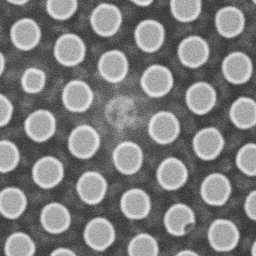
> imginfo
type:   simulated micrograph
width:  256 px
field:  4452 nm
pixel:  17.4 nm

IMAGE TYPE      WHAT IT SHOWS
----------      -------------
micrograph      a regular array of raised bodies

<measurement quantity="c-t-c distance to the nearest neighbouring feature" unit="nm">806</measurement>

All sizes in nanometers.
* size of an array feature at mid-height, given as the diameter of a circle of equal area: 506